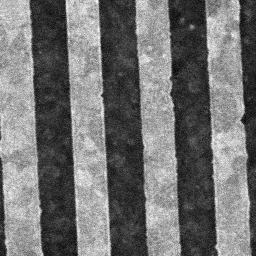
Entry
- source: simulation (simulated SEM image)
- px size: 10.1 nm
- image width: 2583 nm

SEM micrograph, one or a few lines or trenches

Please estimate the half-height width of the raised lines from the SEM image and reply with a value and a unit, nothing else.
321 nm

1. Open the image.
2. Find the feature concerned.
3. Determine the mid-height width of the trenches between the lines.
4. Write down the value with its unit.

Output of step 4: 379 nanometres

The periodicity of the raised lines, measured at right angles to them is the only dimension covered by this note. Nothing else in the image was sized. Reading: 69.8 pixels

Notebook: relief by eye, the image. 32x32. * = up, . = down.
****....****.....****.....****..
****....****.....****.....****..
****....****.....****.....****..
****....****.....****.....****..
****....****.....****.....****..
****.....***.....****.....****..
****.....****....****.....****..
****.....****....****.....****..
****.....****....****.....****..
****.....****....****.....****..
****.....****.....***.....****..
****.....****.....***.....****..
****.....****.....***.....****..
****.....****.....****....****..
****.....****.....****....****..
****.....****.....****....****..
****.....****.....****.....****.
****.....****.....****....*****.
****.....****.....****.....****.
*****....****.....****.....****.
*****....****.....****.....****.
.****....****.....****.....****.
*****....****.....****.....****.
*****....****.....****.....****.
.****....****.....****.....****.
.****.....***.....****.....****.
.****.....***.....****.....****.
.****.....****....****.....****.
.****.....****....****.....****.
.****.....****....****.....****.
.****.....****....*****....****.
.****.....****.....***.....****.